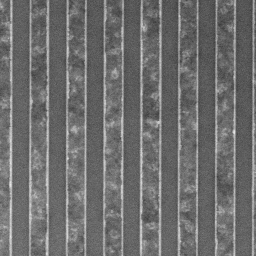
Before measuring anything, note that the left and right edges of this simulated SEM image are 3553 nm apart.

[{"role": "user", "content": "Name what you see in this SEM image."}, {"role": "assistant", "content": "parallel lines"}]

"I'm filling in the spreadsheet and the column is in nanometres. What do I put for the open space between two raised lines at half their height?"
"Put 258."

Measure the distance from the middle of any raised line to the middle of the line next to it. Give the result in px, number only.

37.3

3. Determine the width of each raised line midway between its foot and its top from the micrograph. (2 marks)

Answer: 258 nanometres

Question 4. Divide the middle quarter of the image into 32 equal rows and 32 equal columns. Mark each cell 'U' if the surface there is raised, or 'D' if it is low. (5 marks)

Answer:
DUUUUDDDDDUUUUUDDDDDUUUUDDDDDUUU
DUUUUDDDDDUUUUUDDDDDUUUUDDDDDUUU
DUUUUDDDDDUUUUUDDDDDUUUUDDDDDUUU
DUUUUDDDDDUUUUUDDDDDUUUUDDDDDUUU
DUUUUDDDDDUUUUUDDDDDUUUUDDDDDUUU
DUUUUDDDDDUUUUUDDDDDUUUUDDDDDUUU
DUUUUDDDDDUUUUUDDDDUUUUUDDDDDUUU
DUUUUDDDDDUUUUUDDDDUUUUUDDDDDUUU
DUUUUDDDDDUUUUUDDDDUUUUUDDDDDUUU
DUUUUDDDDDUUUUUDDDDUUUUUDDDDDUUU
DUUUUDDDDDUUUUUDDDDUUUUUDDDDDUUU
DUUUUDDDDDUUUUUDDDDUUUUUDDDDDUUU
DUUUUDDDDDUUUUUDDDDUUUUUDDDDDUUU
DUUUUDDDDDUUUUUDDDDUUUUUDDDDDUUU
DUUUUDDDDDUUUUDDDDDUUUUUDDDDDUUU
DUUUUDDDDDUUUUDDDDDUUUUUDDDDDUUU
DUUUUDDDDDUUUUDDDDDUUUUUDDDDDUUU
DUUUUDDDDDUUUUDDDDDUUUUUDDDDDUUU
DUUUUDDDDDUUUUUDDDDUUUUUDDDDDUUU
DUUUUDDDDDUUUUUDDDDUUUUUDDDDDUUU
DUUUUDDDDDUUUUUDDDDUUUUUDDDDDUUU
DUUUUDDDDDUUUUUDDDDUUUUUDDDDDUUU
DUUUUDDDDDUUUUUDDDDUUUUUDDDDDUUU
DUUUUDDDDDUUUUUDDDDUUUUUDDDDDUUU
DUUUUDDDDDUUUUUDDDDUUUUUDDDDDUUU
DUUUUDDDDDUUUUUDDDDUUUUUDDDDDUUU
DUUUUDDDDDUUUUUDDDDUUUUUDDDDDUUU
DUUUUDDDDDUUUUDDDDDUUUUUDDDDDUUU
DUUUUDDDDDUUUUDDDDDUUUUUDDDDDUUU
DUUUUDDDDDUUUUUDDDDUUUUUDDDDDUUU
DUUUUDDDDDUUUUUDDDDUUUUUDDDDDUUU
DUUUUDDDDDUUUUDDDDDUUUUUDDDDDUUU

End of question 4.